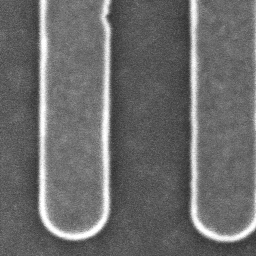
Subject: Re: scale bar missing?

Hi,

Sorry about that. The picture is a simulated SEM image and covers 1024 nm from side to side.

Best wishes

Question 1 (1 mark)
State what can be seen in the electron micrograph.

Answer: one or a few lines or trenches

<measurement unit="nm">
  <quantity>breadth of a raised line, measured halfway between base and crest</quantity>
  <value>262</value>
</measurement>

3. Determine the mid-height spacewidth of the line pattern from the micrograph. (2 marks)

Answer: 346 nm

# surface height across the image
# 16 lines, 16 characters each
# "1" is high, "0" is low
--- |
0001111000001111
0001111000001111
0001111000001111
0001111000001111
0001111000001111
0001111000001111
0001111000001111
0001111000001111
0001111000001111
0001111000001111
0001111000001111
0001111000001111
0001111000001111
0001111000001111
0001110000000110
0000000000000000